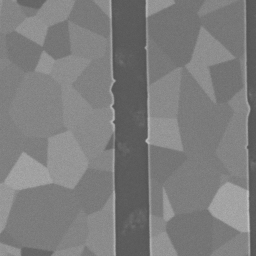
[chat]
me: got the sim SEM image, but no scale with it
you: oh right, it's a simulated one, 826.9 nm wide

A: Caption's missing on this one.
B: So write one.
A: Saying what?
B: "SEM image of one or a few lines or trenches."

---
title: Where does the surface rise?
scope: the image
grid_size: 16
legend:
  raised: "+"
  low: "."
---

+++++++..++++++.
+++++++..++++++.
+++++++..++++++.
+++++++..++++++.
+++++++..++++++.
+++++++..++++++.
+++++++..+++++++
+++++++..++++++.
+++++++..++++++.
+++++++..++++++.
+++++++..++++++.
+++++++..+++++++
+++++++..+++++++
+++++++..+++++++
+++++++..+++++++
+++++++..+++++++